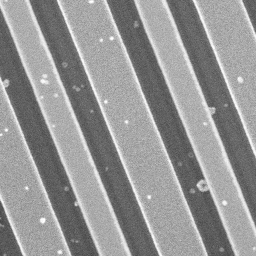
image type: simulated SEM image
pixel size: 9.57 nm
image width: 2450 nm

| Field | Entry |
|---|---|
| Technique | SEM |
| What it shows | lines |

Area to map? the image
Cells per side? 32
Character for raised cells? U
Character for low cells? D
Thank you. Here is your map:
UUUUDDDUUUUUUDDDDUUUUDDDUUUUUUDD
UUUUDDDDUUUUUUDDDUUUUDDDDUUUUUUD
DUUUDDDDUUUUUUDDDDUUUUDDDUUUUUUD
DUUUUDDDDUUUUUUDDDUUUUDDDDUUUUUU
DDUUUDDDDUUUUUUDDDDUUUDDDDUUUUUU
DDUUUUDDDUUUUUUDDDDUUUUDDDUUUUUU
DDUUUUDDDDUUUUUUDDDUUUUDDDDUUUUU
DDDUUUUDDDUUUUUUDDDDUUUUDDDUUUUU
DDDUUUUDDDDUUUUUUDDDUUUUDDDDUUUU
DDDDUUUDDDDUUUUUUDDDDUUUDDDDUUUU
DDDDUUUUDDDUUUUUUDDDDUUUUDDDUUUU
UDDDUUUUDDDDUUUUUUDDDUUUUDDDDUUU
UDDDDUUUUDDDUUUUUUDDDDUUUUDDDUUU
UDDDDUUUUDDDDUUUUUUDDDUUUUDDDDUU
UUDDDDUUUDDDDUUUUUUDDDDUUUDDDDUU
UUDDDDUUUUDDDUUUUUUDDDDUUUUDDDUU
UUUDDDUUUUDDDDUUUUUUDDDUUUUDDDDU
UUUDDDDUUUUDDDUUUUUUDDDDUUUUDDDU
UUUDDDDUUUUDDDDUUUUUUDDDUUUUDDDD
UUUUDDDDUUUDDDDUUUUUUDDDDUUUDDDD
UUUUDDDDUUUUDDDUUUUUUDDDDUUUUDDD
UUUUUDDDUUUUDDDDUUUUUUDDDUUUUDDD
UUUUUDDDDUUUUDDDUUUUUUDDDDUUUUDD
UUUUUUDDDUUUUDDDDUUUUUUDDDUUUUDD
UUUUUUDDDDUUUDDDDUUUUUUDDDDUUUDD
UUUUUUDDDDUUUUDDDUUUUUUDDDDUUUUD
DUUUUUUDDDUUUUDDDDUUUUUUDDDUUUUD
DUUUUUUDDDDUUUUDDDUUUUUUDDDDUUUU
DDUUUUUUDDDUUUUDDDDUUUUUUDDDUUUU
DDUUUUUUDDDDUUUDDDDUUUUUUDDDDUUU
DDUUUUUUDDDDUUUUDDDUUUUUUDDDDUUU
DDDUUUUUUDDDUUUUDDDDUUUUUUDDDUUU